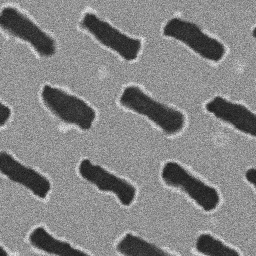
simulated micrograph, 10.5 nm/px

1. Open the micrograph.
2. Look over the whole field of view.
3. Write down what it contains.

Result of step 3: holes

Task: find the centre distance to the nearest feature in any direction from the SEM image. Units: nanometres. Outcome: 865